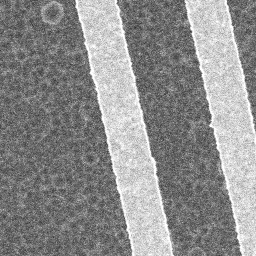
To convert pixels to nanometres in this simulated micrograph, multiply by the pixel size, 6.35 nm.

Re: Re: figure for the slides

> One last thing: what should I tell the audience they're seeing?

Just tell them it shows one or a few lines or trenches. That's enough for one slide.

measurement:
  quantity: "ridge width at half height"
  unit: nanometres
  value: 249